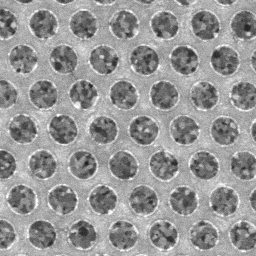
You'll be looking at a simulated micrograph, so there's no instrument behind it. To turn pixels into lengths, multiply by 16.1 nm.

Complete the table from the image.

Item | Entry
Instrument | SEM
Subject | a regular array of raised bodies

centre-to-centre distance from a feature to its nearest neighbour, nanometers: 647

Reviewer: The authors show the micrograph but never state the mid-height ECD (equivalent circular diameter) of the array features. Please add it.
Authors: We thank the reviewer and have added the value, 0.477 µm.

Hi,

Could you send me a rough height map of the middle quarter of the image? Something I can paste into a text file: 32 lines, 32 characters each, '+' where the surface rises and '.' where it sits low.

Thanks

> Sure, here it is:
+++....++++++....+++++++...+++++
+++....++++++....++++++.....++++
++.......++........+++.......+++
................................
...+++.......+++.......+++......
..++++++....+++++.....++++++....
.+++++++....++++++....++++++....
.++++++++..++++++++..++++++++...
.++++++++...+++++++..++++++++...
..++++++....++++++....++++++....
...++++......+++++.....+++++....
...............+................
................................
++......++++......++++......++++
+++....++++++....++++++....+++++
+++...+++++++...+++++++....+++++
+++...+++++++...++++++++...+++++
+++...+++++++...++++++++...+++++
+++....++++++....++++++....+++++
++......++++......++++......++++
................................
........................+.......
..+++++.....+++++.....+++++.....
.+++++++....++++++....++++++....
.+++++++...+++++++...+++++++...+
.+++++++...++++++++..++++++++..+
.+++++++...++++++++...+++++++...
..++++++....++++++....++++++....
...++++......++++......++++.....
................................
+.......+++........++...........
++.....+++++.....+++++.....+++++